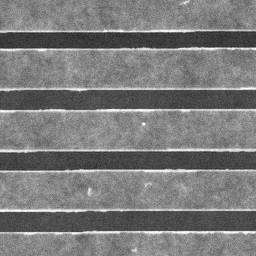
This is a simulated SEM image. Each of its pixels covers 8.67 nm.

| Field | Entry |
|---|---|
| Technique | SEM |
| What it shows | lines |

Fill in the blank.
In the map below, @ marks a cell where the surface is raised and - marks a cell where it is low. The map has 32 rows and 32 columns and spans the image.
@@@@@@@@@@@@@@@@@@@@@@@@@@@@@@@@
@@@@@@@@@@@@@@@@@@@@@@@@@@@@@@@@
@@@@@@@@@@@@@@@@@@@@@@@@@@@@@@@@
@@@@@@@@@@@@@@@@@@@@@@@@@@@@@@@@
--------------------------------
--------------------------------
@@@@@@@@@@@@@@@@@@@@@@@@@@@@@@@@
@@@@@@@@@@@@@@@@@@@@@@@@@@@@@@@@
@@@@@@@@@@@@@@@@@@@@@@@@@@@@@@@@
@@@@@@@@@@@@@@@@@@@@@@@@@@@@@@@@
@@@@@@@@@@@@@@@@@@@@@@@@@@@@@@@@
--------------------------------
--------------------------------
--------------------------------
@@@@@@@@@@@@@@@@@@@@@@@@@@@@@@@@
@@@@@@@@@@@@@@@@@@@@@@@@@@@@@@@@
@@@@@@@@@@@@@@@@@@@@@@@@@@@@@@@@
@@@@@@@@@@@@@@@@@@@@@@@@@@@@@@@@
@@@@@@@@@@@@@@@@@@@@@@@@@@@@@@@@
--------------------------------
--------------------------------
@@@@@@@@@@@@@@@@@@@@@@@@@@@@@@@@
@@@@@@@@@@@@@@@@@@@@@@@@@@@@@@@@
@@@@@@@@@@@@@@@@@@@@@@@@@@@@@@@@
@@@@@@@@@@@@@@@@@@@@@@@@@@@@@@@@
@@@@@@@@@@@@@@@@@@@@@@@@@@@@@@@@
--------------------------------
--------------------------------
--------------------------------
@@@@@@@@@@@@@@@@@@@@@@@@@@@@@@@@
@@@@@@@@@@@@@@@@@@@@@@@@@@@@@@@@
@@@@@@@@@@@@@@@@@@@@@@@@@@@@@@@@